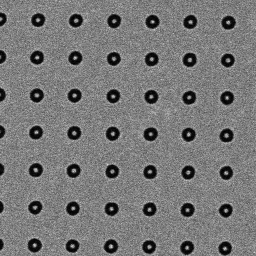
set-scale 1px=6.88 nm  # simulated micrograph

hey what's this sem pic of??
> a regular array of ring-shaped grooves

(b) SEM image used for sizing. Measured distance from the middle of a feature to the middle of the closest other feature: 258 nm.